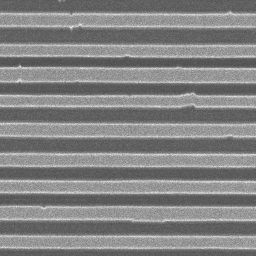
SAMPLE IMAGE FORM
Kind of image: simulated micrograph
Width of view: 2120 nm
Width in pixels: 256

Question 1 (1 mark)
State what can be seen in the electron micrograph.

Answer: parallel lines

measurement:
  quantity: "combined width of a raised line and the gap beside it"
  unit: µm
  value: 0.23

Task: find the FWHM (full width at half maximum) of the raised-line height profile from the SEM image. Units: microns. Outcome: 0.13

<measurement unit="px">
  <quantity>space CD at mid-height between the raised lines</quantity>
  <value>12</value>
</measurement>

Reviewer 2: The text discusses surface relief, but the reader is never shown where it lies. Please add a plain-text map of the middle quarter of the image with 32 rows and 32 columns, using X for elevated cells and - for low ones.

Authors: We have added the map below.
--------------------------------
XXXXXXXXXXXXXXXXXXXXXXXXXXXXXXXX
XXXXXXXXXXXXXXXXXXXXXXXXXXXXXXXX
XXXXXXXXXXXXXXXXXXXXXXXXXXXXXXXX
XXXXXXXXXXXXXXXXXXXXXXXXXXXXXXXX
--------------------------------
--------------------------------
-----------------------------XXX
XXXXXXXXXXXXXXXXXXXXXXXXXXXXXXXX
XXXXXXXXXXXXXXXXXXXXXXXXXXXXXXXX
XXXXXXXXXXXXXXXXXXXXXXXXXXXXXXXX
--------------------------------
--------------------------------
--------------------------------
--------------------------------
XXXXXXXXXXXXXXXXXXXXXXXXXXXXXXXX
XXXXXXXXXXXXXXXXXXXXXXXXXXXXXXXX
XXXXXXXXXXXXXXXXXXXXXXXXXXXXXXXX
-----------------------XXXXXXXXX
--------------------------------
--------------------------------
--------------------------------
XXXXXXXXXXXXXXXXXXXXXXXXXXXXXXXX
XXXXXXXXXXXXXXXXXXXXXXXXXXXXXXXX
XXXXXXXXXXXXXXXXXXXXXXXXXXXXXXXX
XXXXXXXXXXXXXXXXXXXXXXXXXXXXXXXX
--------------------------------
--------------------------------
--------------------------------
XXXXXXXXXXXXXXXXXXXXXXXXXXXXXXXX
XXXXXXXXXXXXXXXXXXXXXXXXXXXXXXXX
XXXXXXXXXXXXXXXXXXXXXXXXXXXXXXXX